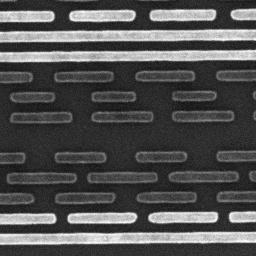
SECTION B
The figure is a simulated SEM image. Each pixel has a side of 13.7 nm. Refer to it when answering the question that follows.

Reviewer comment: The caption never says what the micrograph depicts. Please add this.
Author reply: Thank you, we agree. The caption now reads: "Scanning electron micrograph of wiring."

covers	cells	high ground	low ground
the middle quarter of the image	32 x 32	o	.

................................
................................
oooooooooooo......oooooooooooooo
oooooooooooo......oooooooooooooo
................................
................................
................................
.......ooooooooooo.........ooooo
.......ooooooooooo.........ooooo
................................
................................
................................
oo.....ooooooooooooooo.....ooooo
oo.....ooooooooooooooo.....ooooo
................................
................................
................................
................................
................................
................................
................................
................................
oooooooooo........ooooooooooooo.
oooooooooo........ooooooooooooo.
.ooo............................
................................
................................
ooo...ooooooooooooooooo....ooooo
ooo...ooooooooooooooooo....ooooo
................................
................................
................................